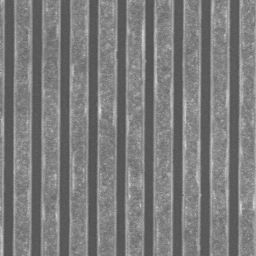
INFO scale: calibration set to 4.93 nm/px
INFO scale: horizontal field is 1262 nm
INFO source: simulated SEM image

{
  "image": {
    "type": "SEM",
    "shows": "parallel lines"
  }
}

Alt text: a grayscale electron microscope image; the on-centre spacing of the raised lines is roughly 0.139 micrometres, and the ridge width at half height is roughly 90.7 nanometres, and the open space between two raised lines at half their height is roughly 50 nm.